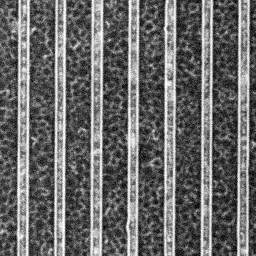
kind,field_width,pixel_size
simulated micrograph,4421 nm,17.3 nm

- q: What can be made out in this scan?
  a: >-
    parallel lines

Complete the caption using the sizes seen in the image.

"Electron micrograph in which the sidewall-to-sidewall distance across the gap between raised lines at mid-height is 27.7 px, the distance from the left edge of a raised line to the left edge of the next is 634 nm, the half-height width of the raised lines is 0.145 um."